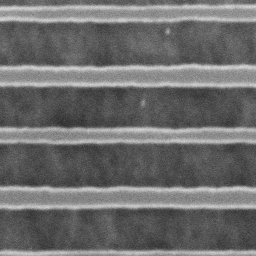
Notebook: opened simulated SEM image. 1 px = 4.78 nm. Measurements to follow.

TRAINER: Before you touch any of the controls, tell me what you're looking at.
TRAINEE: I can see lines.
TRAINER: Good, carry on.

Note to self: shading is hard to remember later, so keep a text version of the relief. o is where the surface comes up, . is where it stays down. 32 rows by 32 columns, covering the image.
................................
oooooooooooooooooooooooooooooooo
o.ooooooooooooooooooooo....ooooo
................................
................................
................................
................................
................................
oooooooooooooooooooooooooooooooo
oooooooooooooooooooooooooooooooo
oooooooooooooooooooooooooooooooo
................................
................................
................................
................................
................................
oooooooooooooooooooooooooooooooo
oooooooooooooooooooooooooooooooo
................................
................................
................................
................................
................................
ooooooo...oo.ooooooo....oooooooo
oooooooooooooooooooooooooooooooo
oooooooooooooooooooooooooooooooo
................................
................................
................................
................................
................................
ooo..ooooooooooooooooooooooooooo